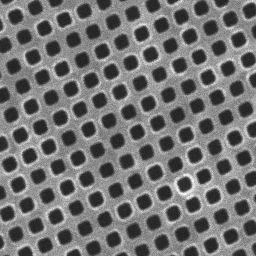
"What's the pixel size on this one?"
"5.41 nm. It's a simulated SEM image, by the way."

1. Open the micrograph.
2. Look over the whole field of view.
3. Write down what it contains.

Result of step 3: a regular array of holes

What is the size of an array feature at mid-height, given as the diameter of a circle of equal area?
84.2 nanometers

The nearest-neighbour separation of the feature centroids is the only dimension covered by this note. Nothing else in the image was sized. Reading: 117 nm